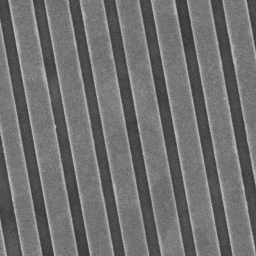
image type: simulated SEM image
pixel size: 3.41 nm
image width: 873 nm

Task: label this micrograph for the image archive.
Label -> parallel lines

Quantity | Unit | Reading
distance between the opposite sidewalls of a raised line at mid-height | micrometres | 0.0784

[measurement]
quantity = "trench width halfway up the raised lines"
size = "39.1 nanometres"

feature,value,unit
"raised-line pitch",0.119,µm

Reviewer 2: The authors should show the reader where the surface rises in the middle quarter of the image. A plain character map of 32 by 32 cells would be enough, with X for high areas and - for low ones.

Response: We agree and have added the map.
XXXX---XXXXXX---XXXXXX---XXXXXX-
XXXX---XXXXXX---XXXXXX---XXXXXX-
XX-----XXXXXX---XXXXXX---XXXXXX-
XXXX----XXXXX---XXXXXX---XXXXXX-
XXXXX---XXXXX----XXXXX---XXXXXX-
XXXXX---XXXXXX---XXXXXX---XXXXXX
XXXXX---XXXXXX---XXXXXX---XXXXXX
XXXXX---XXXXXX---XXXXXX---XXXXXX
XXXXX---XXXXXX---XXXXXX---XXXXXX
XXXXXX---XXXXX----XXXXX---XXXXXX
XXXXXX---XXXXX----XXXXX---XXXXXX
XXXXXX---XXXXXX---XXXXXX---XXXXX
XXXXXX---XXXXXX---XXXXXX---XXXXX
XXXXXX---XXXXXX---XXXXXX---XXXXX
-XXXXX---XXXXXX---XXXXXX---XXXXX
-XXXXXX---XXXXX----XXXXX---XXXXX
-XXXXXX---XXXXXX---XXXXXX---XXXX
-XXXXXX---XXXXXX---XXXXXX---X-XX
-XXXXXX---XXXXXX---XXXXXX---XXXX
-XXX--X---XXXXXX---XXXXXX---XXXX
--XXXXXX---XXXXX----XXXXX---XXXX
--XXXXXX---XXXXX----XXXXX---XXXX
--XXXXXX---XXXXXX---XXXXXX---XXX
--XXXXXX---XXXXXX---XXXXXX---XXX
--XXXXXX---XXXXXX---XXXXXX---XXX
--XXXXXX---XXXXXX---XXXXXX---XXX
---XXXXXX---XXXXX----XXXXX---XXX
---XXXXXX---XXXXXX---XXXXXX---XX
---XXXXXX---XXXXXX---XXXXXX---XX
---XXXXXX---XXXXXX---XXXXXX---XX
---XXXXXX---XXXXXX---XXXXXX---XX
X---XXXXXX---XXXXX----XXXXX---XX